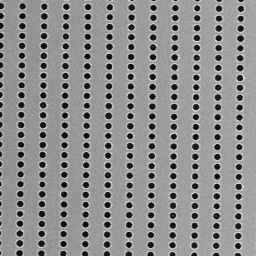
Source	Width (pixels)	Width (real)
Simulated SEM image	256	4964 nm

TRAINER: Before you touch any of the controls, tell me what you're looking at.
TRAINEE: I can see a regular array of holes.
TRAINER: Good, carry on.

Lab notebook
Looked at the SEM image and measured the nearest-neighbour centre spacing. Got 186 nanometres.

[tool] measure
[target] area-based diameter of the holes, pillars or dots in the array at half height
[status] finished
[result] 0.128 microns